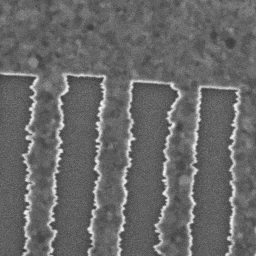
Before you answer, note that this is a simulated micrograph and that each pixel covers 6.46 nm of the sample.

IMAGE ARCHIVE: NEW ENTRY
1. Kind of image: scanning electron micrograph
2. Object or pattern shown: one or a few lines or trenches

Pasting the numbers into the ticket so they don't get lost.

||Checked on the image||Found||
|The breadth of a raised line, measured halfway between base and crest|29.9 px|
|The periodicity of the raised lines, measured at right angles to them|0.442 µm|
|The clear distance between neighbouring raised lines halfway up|249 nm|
